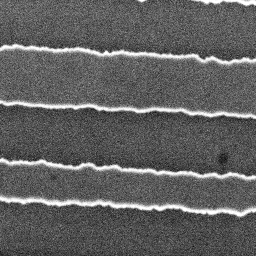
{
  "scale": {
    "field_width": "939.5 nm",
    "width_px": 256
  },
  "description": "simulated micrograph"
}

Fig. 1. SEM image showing lines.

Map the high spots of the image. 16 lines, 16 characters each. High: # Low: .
................
................
................
############....
################
################
################
................
................
................
########........
################
################
................
................
................